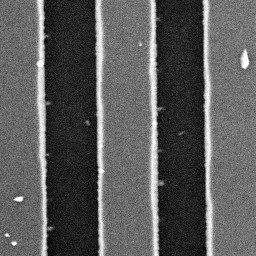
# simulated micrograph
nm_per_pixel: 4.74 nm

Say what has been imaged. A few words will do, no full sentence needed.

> lines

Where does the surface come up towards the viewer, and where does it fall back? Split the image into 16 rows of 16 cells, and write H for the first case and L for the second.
HHHLLLHHHHLLLHHH
HHHLLLHHHHLLLHHH
HHHLLLHHHHLLLHHH
HHHLLLHHHHLLLHHH
HHHLLLHHHHLLLHHH
HHHLLLHHHHLLLHHH
HHHLLLHHHHLLLHHH
HHHLLLHHHHLLLHHH
HHHLLLHHHHLLLHHH
HHHLLLHHHHLLLHHH
HHHLLLHHHHLLLHHH
HHHLLLHHHHLLLHHH
HHHLLLHHHHLLLHHH
HHHLLLHHHHLLLHHH
HHHLLLHHHHLLLHHH
HHHLLLHHHHLLLHHH